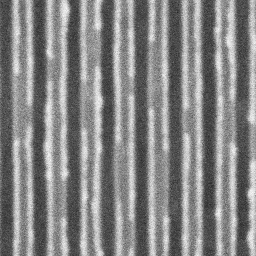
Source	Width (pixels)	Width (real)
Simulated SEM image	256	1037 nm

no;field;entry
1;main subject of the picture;parallel lines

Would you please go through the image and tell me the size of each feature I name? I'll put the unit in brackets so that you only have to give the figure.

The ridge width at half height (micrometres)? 0.0765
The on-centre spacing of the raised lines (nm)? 137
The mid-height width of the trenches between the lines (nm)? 58.2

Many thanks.